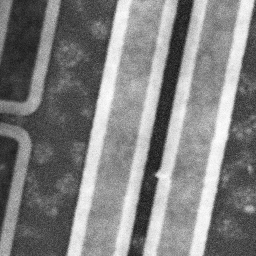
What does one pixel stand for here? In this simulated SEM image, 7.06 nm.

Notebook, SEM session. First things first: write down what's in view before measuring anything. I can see one or a few lines or trenches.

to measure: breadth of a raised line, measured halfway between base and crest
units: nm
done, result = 322